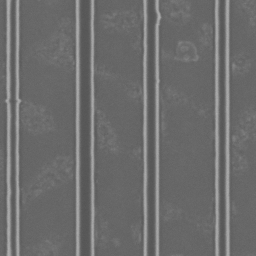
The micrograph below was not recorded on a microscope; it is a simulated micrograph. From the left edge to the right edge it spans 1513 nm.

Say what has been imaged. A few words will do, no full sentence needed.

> one or a few lines or trenches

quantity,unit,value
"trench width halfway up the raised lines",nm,351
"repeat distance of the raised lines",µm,0.412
